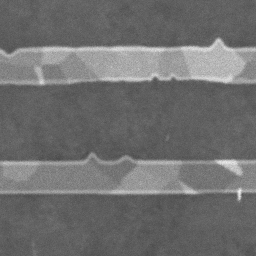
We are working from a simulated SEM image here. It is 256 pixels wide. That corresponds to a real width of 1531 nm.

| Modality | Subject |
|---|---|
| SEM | one or a few lines or trenches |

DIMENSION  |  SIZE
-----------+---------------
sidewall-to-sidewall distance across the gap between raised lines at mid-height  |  0.485 um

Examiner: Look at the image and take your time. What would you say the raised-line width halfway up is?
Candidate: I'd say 0.179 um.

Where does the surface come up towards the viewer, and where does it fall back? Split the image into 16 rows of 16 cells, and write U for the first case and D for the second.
DDDDDDDDDDDDDDDD
DDDDDDDDDDDDDDDD
DDDDDDDDDDDDDDDD
UUUUUUUUUUUUUUUU
UUUUUUUUUUUUUUUU
DDDDDDDDDDDDDDDD
DDDDDDDDDDDDDDDD
DDDDDDDDDDDDDDDD
DDDDDDDDDDDDDDDD
DDDDDDDDDDDDDDDD
UUUUUUUUUUUUUUUU
UUUUUUUUUUUUUUUU
DDDDDDDDDDDDDDDD
DDDDDDDDDDDDDDDD
DDDDDDDDDDDDDDDD
DDDDDDDDDDDDDDDD